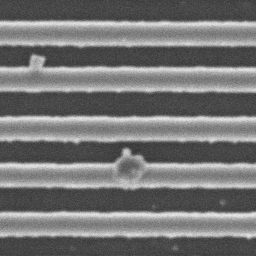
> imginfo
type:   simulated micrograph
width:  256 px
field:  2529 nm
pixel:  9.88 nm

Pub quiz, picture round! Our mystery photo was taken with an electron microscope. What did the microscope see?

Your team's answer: lines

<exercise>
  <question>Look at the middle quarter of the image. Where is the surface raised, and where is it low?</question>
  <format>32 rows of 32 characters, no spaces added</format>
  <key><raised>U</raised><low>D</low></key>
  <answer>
DDDDDDDDDDDDDDDDDDDDDDDDDDDDDDDD
UUUUUUUUUUUUUUUUUUUUUUUUUUUUUUUU
UUUUUUUUUUUUUUUUUUUUUUUUUUUUUUUU
UUUUUUUUUUUUUUUUUUUUUUUUUUUUUUUU
UUUUUUUUUUUUUUUUUUUUUUUUUUUUUUUU
UUUUUUUUUUUUUUUUUUUUUUUUUUUUUUUU
UUUUUUUUUUUUUUUUUUUUUUUUUUUUUUUU
DDDDDDDDDDDDDDDDDDDDDDDDDDDDDDDD
DDDDDDDDDDDDDDDDDDDDDDDDDDDDDDDD
DDDDDDDDDDDDDDDDDDDDDDDDDDDDDDDD
DDDDDDDDDDDDDDDDDDDDDDDDDDDDDDDD
DDDDDDDDDDDDDDDDDDDDDDDDDDDDDDDD
DDDDDDDDDDDDDDDDDDDDDDDDDDDDDDDD
UUUUUUUUUUUUUUDUUUUUUUUUUUUUUUUU
UUUUUUUUUUUUUUUUUUUUUUUUUUUUUUUU
UUUUUUUUUUUUUUUUUUUUUUUUUUUUUUUU
UUUUUUUUUUUUUUUUUUUUUUUUUUUUUUUU
UUUUUUUUUUUUUUUUUUUUUUUUUUUUUUUU
UUUUUUUUUUUUUUUUUUUUUUUUUUUUUUUU
DDDDDDDDDDDDDDDDDDDDDDDDDDDDDDDD
DDDDDDDDDDDDDDDDDDDDDDDDDDDDDDDD
DDDDDDDDDDDDDDDUDDDDDDDDDDDDDDDD
DDDDDDDDDDDDDDDUDDDDDDDDDDDDDDDD
DDDDDDDDDDDDDDUUUUUUDDDDDDDDDDDD
DDDDDDDDDDDDDUUUUUUUDDDDDDDDDDDD
UUUUUUUUUUUUUUUUUUUUUUUUUUUUUUUU
UUUUUUUUUUUUUUUUUUUUUUUUUUUUUUUU
UUUUUUUUUUUUUUUUUUUUUUUUUUUUUUUU
UUUUUUUUUUUUUUUUUUUUUUUUUUUUUUUU
UUUUUUUUUUUUUUUUUUUUUUUUUUUUUUUU
UUUUUUUUUUUUUUUUUUUUUUUUUUUUUUUU
DDDDDDDDDDDDDDDDDDDDDDDDDDDDDDDD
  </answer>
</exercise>